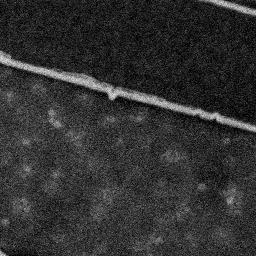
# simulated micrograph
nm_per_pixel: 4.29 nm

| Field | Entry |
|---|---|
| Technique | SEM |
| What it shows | one or a few lines or trenches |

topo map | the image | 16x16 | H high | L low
HHHHHHHHHHHHHHHL
HHHHHHHHHHHHHHHH
HHHHHHHHHHHHHHHH
HHHHHHHHHHHHHHHH
LLLHHHHHHHHHHHHH
LLLLLLHHHHHHHHHH
LLLLLLLLLLHHHHHH
LLLLLLLLLLLLLLHH
LLLLLLLLLLLLLLLL
LLLLLLLLLLLLLLLL
LLLLLLLLLLLLLLLL
LLLLLLLLLLLLLLLL
LLLLLLLLLLLLLLLL
LLLLLLLLLLLLLLLL
LLLLLLLLLLLLLLLL
LLLLLLLLLLLLLLLL